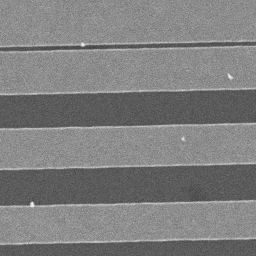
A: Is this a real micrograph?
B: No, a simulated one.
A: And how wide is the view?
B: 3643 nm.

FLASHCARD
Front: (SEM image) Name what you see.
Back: wiring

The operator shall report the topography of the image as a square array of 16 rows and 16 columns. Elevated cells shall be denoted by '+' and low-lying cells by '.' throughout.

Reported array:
++++++++++++++++
++++++++++++++++
++++++++++++++++
++++++++++++++++
++++++++++++++++
++++++++++++++++
................
................
++++++++++++++++
++++++++++++++++
++++............
................
................
++++++++++++++++
++++++++++++++++
................